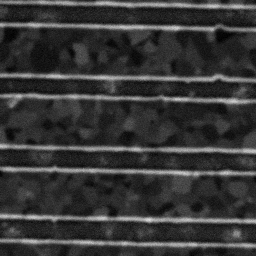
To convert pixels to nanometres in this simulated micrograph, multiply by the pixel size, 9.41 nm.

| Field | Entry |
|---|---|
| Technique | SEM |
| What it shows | one or a few lines or trenches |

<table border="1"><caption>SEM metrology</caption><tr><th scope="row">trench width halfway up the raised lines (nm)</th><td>218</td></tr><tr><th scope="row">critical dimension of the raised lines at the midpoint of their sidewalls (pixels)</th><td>50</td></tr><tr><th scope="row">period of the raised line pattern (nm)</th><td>672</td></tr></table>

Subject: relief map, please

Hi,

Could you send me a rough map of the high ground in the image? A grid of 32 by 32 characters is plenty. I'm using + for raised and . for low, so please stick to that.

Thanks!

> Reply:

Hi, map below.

................++++++++++++++++
................................
................................
++++++++++++++++++++.......+....
++++++++++++++++++++++++++++++++
++++++++++++++++++++++++++++++++
++++++++++++++++++++++++++++++++
++++++++++++++++++++++++++++++++
++++++++++++++++++++++++++++++++
.....+++++++++++++++++++++++++++
................................
................................
+++++++++++++++++++++++.........
++++++++++++++++++++++++++++++++
++++++++++++++++++++++++++++++++
++++++++++++++++++++++++++++++++
++++++++++++++++++++++++++++++++
++++++++++++++++++++++++++++++++
..........+++.++++++++++++++++++
................................
................................
+++++++++++++++.+...............
++++++++++++++++++++++++++++++++
++++++++++++++++++++++++++++++++
++++++++++++++++++++++++++++++++
++++++++++++++++++++++++++++++++
++++++++++++++++++++++++++++++++
....................+.....++++++
................................
................................
++++++++++++++.+................
++++++++++++++++++++++++++++++++